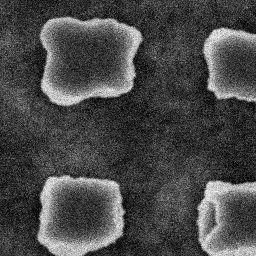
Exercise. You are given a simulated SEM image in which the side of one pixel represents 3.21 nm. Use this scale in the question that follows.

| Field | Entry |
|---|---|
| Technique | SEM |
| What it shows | raised bodies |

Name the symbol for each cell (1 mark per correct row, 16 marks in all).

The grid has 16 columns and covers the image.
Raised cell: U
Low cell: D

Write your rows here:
DDDDDDDDDDDDDDDD
DDDUUUUUDDDDDDDD
DDDUUUUUUDDDDUUU
DDDUUUUUDDDDDUUU
DDDUUUUUDDDDDUUU
DDDUUUUUDDDDDUUU
DDDDDDDDDDDDDDDD
DDDDDDDDDDDDDDDD
DDDDDDDDDDDDDDDD
DDDDDDDDDDDDDDDD
DDDDDDDDDDDDDDDD
DDDUUUUDDDDDDDDD
DDDUUUUUDDDDDUUU
DDDUUUUUDDDDDUUU
DDDUUUUDDDDDDUUU
DDDUUUDDDDDDDUUU